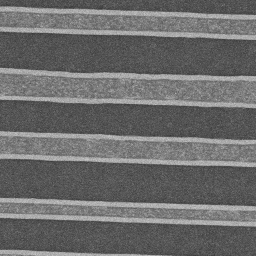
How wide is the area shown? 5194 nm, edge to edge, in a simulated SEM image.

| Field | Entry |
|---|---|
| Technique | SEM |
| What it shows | one or a few lines or trenches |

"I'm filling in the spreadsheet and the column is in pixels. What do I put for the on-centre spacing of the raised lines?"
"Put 63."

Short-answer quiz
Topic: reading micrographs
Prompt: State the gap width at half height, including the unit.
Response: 0.867 µm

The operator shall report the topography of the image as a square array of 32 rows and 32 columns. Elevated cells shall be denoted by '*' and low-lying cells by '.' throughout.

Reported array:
................................
**********......................
********************************
********************************
...........................*****
................................
................................
................................
................................
***********.**.*................
********************************
********************************
.........***********************
................................
................................
................................
................................
*********************..*........
********************************
..******************************
................................
................................
................................
................................
................................
************....................
********************************
..................**************
................................
................................
................................
................................